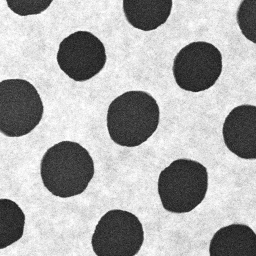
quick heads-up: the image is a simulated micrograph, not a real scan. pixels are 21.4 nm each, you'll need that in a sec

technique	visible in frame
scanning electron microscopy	holes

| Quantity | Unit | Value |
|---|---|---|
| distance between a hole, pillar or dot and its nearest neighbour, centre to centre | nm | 1780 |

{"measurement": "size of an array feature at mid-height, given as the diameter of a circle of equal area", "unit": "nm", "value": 1120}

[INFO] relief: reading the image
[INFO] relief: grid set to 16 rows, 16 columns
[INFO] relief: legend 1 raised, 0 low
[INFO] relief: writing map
1001111100011110
1111111100111110
1111001111111111
1111000111100011
1111001111100011
0011111111100111
0001111000111111
0011111000111100
1111111001111100
1110011111111110
1110001111000111
1110001111000111
0111111111000111
0111110011111111
0111110001111100
1111110001111000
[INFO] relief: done